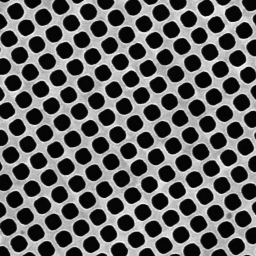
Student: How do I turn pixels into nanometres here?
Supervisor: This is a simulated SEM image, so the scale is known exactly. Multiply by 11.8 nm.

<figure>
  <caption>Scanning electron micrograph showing a regular array of holes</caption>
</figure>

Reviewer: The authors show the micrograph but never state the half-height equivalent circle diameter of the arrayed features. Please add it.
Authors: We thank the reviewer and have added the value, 200 nm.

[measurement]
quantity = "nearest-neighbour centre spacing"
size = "233 nanometres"